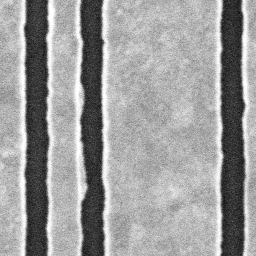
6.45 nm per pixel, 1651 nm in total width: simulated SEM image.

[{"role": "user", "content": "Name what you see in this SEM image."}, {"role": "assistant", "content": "lines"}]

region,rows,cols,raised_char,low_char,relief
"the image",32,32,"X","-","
XXX---XXXX---XXXXXXXXXXXXXXX--XX
XXX---XXXX---XXXXXXXXXXXXXXX--XX
XXX---XXXX---XXXXXXXXXXXXXXX---X
XXX---XXXX---XXXXXXXXXXXXXX----X
XXX---XXXX---XXXXXXXXXXXXXX----X
XXX---XXXX---XXXXXXXXXXXXXXX---X
XXX---XXXX---XXXXXXXXXXXXXXX--XX
XXX---XXXX---XXXXXXXXXXXXXX---XX
XXX---XXXX---XXXXXXXXXXXXXXX--XX
XXX---XXXX---XXXXXXXXXXXXXX---XX
XXX---XXXX---XXXXXXXXXXXXXX----X
XXX---XXXX---XXXXXXXXXXXXXX----X
XXX---XXXX---XXXXXXXXXXXXXX----X
XXX---XXXX---XXXXXXXXXXXXXX----X
XXX---XXXX---XXXXXXXXXXXXXX----X
XXX---XXXX---XXXXXXXXXXXXXXX---X
XXX---XXXX---XXXXXXXXXXXXXXX---X
XXX---XXXX---XXXXXXXXXXXXXXX---X
XXX---XXXX---XXXXXXXXXXXXXXX---X
XXX---XXXX---XXXXXXXXXXXXXXX---X
XXX---XXXX---XXXXXXXXXXXXXXX---X
XXX---XXXX---XXXXXXXXXXXXXXX---X
XXX---XXXX---XXXXXXXXXXXXXX----X
XXX---XXXX---XXXXXXXXXXXXXX----X
XXX---XXXX---XXXXXXXXXXXXXXX---X
XXX---XXXX---XXXXXXXXXXXXXX----X
XXX---XXXX---XXXXXXXXXXXXXXX---X
XXX---XXXX---XXXXXXXXXXXXXXX---X
XXX---XXXX---XXXXXXXXXXXXXXX---X
XXX---XXXX---XXXXXXXXXXXXXXX---X
XXX---XXXX---XXXXXXXXXXXXXXX---X
XXX---XXXX---XXXXXXXXXXXXXX----X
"